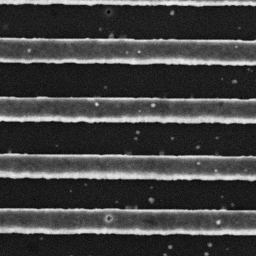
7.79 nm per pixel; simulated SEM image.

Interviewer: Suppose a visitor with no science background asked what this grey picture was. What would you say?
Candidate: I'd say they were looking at lines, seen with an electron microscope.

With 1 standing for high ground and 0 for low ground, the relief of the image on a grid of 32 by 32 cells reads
00000000001101111111111111111111
00000000000000000000000000000000
00000000000000000000000000000000
00000000000000000000000000000000
00000000000000000000000000000000
11111111111111111111111111111111
11111111111111111111111111111111
11111111111111111111111111111111
00000000000000000000000000000000
00000000000000000000000000000000
00000000000000000000000000000000
00000000000000000000000000000000
11111111111111111111111111111101
11111111111111111111111111111111
11111111111111111111111111111111
00000000000000000000000000000000
00000000000000000000000000000000
00000000000000000000000000000000
00000000000000000000000000000000
11111111111111110000000000000000
11111111111111111111111111111111
11111111111111111111111111111111
00000000000000000000000000000000
00000000000000000000000000000000
00000000000000000000000000000000
00000000000000000000000000000000
11111111111111111111111111111111
11111111111111111111111111111111
11111111111111111111111111111111
00000000000000000000000000000000
00000000000000000000000000000000
00000000000000000000000000000000